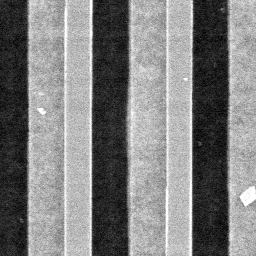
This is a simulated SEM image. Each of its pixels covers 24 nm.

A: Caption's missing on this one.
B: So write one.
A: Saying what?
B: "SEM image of lines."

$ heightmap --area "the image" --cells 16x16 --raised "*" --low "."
..****..****..**
..****..****..**
..****..****..**
..****..****..**
..****..****..**
..****..****..**
..****..****..**
..****..****..**
..****..****..**
..****..****..**
..****..****..**
..****..****..**
..****..****..**
..****..****..**
..****..****..**
..****..****..**